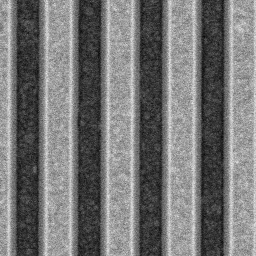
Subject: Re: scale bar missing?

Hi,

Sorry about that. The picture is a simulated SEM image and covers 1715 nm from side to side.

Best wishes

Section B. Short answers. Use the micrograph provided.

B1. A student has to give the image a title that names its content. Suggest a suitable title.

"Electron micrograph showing parallel lines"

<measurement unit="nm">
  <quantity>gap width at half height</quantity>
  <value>206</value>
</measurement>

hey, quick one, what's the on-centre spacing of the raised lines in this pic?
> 413 nanometers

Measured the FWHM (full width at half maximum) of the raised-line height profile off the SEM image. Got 205 nm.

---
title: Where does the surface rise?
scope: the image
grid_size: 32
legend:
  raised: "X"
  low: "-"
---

XX----XXX----XXXX----XXXX----XXX
XX----XXX----XXXX----XXXX----XXX
XX----XXX----XXXX----XXXX----XXX
XX----XXX----XXXX----XXXX----XXX
XX----XXX----XXXX----XXXX----XXX
XX---XXXX----XXXX----XXXX----XXX
XX---XXXX----XXXX----XXXX----XXX
XX---XXXX----XXXX----XXXX----XXX
XX---XXXX----XXXX----XXXX----XXX
XX---XXXX----XXXX----XXXX----XXX
XX---XXXX----XXXX----XXXX---XXXX
XX---XXXX----XXXX----XXXX---XXXX
XX---XXXX----XXXX----XXXX---XXXX
XX---XXXX----XXXX----XXXX----XXX
XX---XXXX----XXXX----XXXX----XXX
XX---XXXX----XXXX----XXXX----XXX
XX---XXXX----XXXX----XXXX----XXX
XX---XXXX----XXXX----XXXX----XXX
XX---XXXX----XXXX----XXXX----XXX
XX---XXXX----XXXX----XXXX----XXX
XX---XXXX----XXXX----XXXX----XXX
X----XXXX----XXXX----XXXX----XXX
X----XXXX----XXXX----XXXX----XXX
X----XXXX----XXXX----XXXX----XXX
X----XXXX----XXXX----XXXX----XXX
X----XXXX----XXXX----XXX-----XXX
X----XXXX----XXXX----XXXX----XXX
X----XXXX----XXXX----XXX-----XXX
X----XXXX----XXXX----XXX-----XXX
X----XXXX----XXXX----XXX-----XXX
X----XXXX----XXXX----XXX-----XXX
X----XXXX----XXXX----XXX----XXXX